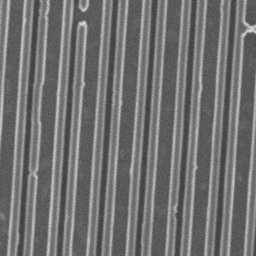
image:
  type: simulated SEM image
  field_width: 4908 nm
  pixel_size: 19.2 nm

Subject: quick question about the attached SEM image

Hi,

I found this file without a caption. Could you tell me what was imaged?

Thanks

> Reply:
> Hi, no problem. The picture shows parallel lines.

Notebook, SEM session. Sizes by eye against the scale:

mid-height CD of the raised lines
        158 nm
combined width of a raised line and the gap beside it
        0.371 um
